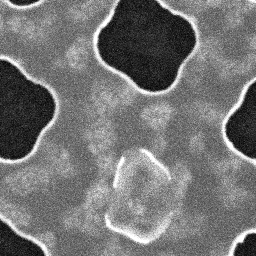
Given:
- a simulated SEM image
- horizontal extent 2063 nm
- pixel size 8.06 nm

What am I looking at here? holes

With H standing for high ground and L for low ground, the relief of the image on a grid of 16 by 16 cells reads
HHHHHHHLLLHHHHHH
HHHHHHHLLLLLHHHH
HHHHHHLLLLLLHHHH
HHHHHHLLLLLLHHHH
LHHHHHHHLLLHHHHH
LLLHHHHHHLHHHHHH
LLLHHHHHHHHHHHHL
LLLHHHHHHHHHHHLL
LLHHHHHHHHHHHHLL
LLHHHHHHHHHHHHHL
HHHHHHHHHHHHHHHH
HHHHHHHHHHHHHHHH
HHHHHHHHHHHHHHHH
HHHHHHHHHHHHHHHH
LHHHHHHHHHHHHHHH
LLLHHHHHHHHHHHHL